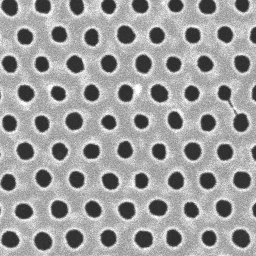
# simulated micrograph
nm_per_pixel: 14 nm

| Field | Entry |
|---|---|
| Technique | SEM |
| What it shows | a regular array of holes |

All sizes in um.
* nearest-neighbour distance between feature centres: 0.444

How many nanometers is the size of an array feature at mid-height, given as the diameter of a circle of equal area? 241